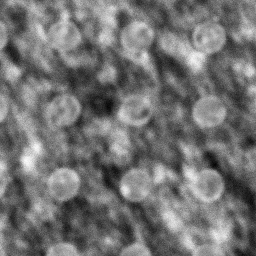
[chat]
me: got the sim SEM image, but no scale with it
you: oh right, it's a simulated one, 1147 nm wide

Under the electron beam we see a regular array of raised bodies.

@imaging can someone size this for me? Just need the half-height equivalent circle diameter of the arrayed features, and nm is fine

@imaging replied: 138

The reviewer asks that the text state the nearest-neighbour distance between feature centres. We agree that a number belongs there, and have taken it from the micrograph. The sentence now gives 72.7 px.